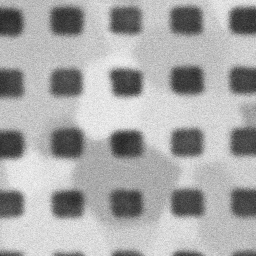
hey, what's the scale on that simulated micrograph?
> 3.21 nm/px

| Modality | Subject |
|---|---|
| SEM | a regular array of holes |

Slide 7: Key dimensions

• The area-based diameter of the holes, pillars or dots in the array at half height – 0.112 um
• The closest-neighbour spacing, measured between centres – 192 nm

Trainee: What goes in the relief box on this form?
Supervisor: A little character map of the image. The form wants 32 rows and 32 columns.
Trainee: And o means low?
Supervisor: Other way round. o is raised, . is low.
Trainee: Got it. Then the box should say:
oooooooooooooooooooooooooooooooo
...ooo....oooo....ooo....oooo...
...ooo....oooo....ooo....oooo...
...ooo....oooo....ooo....oooo...
..oooooo.oooooo..oooooooooooooo.
oooooooooooooooooooooooooooooooo
oooooooooooooooooooooooooooooooo
oooooooooooooooooooooooooooooooo
ooooooo...oooo..oooooo...oooo...
...ooo....oooo....ooo....ooo....
...ooo.....ooo....ooo.....ooo...
...ooo....oooo....oooo...oooo...
oooooooooooooooooooooooooooooooo
oooooooooooooooooooooooooooooooo
oooooooooooooooooooooooooooooooo
oooooooooooooooooooooooooooooooo
...ooo....oooo....ooo....oooo...
...ooo....oooo....ooo.....ooo...
...ooo....oooo....ooo.....ooo...
...oooo...oooo....oooo...oooo..o
oooooooooooooooooooooooooooooooo
oooooooooooooooooooooooooooooooo
oooooooooooooooooooooooooooooooo
oooooooooooooooooooooooooooooo..
...ooo.....ooo....ooo.....ooo...
...ooo.....ooo....ooo.....ooo...
...ooo.....ooo....ooo.....ooo...
o.oooooooooooooooooooooooooooooo
oooooooooooooooooooooooooooooooo
oooooooooooooooooooooooooooooooo
oooooooooooooooooooooooooooooooo
...oooo.o.oooo....oooo...oooo...